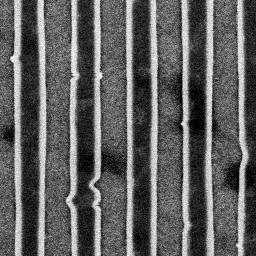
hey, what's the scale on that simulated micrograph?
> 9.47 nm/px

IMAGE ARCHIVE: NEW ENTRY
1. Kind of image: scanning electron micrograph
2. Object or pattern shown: parallel lines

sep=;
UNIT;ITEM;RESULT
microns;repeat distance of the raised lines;0.529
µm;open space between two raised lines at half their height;0.294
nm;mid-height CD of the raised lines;236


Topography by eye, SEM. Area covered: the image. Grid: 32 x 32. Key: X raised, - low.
--XXX----XXX----XXX----XXX----XX
--XXX----XXX----XXX----XXX----XX
--XXX----XXX----XXX----XXX----XX
--XXX----XXX----XXX----XXX----XX
--XXX----XXX----XXX----XXX----XX
--XXX----XXX----XXX----XXX----XX
--XXX----XXX----XXX----XXX----XX
--XXX----XXX----XXX----XXX----XX
--XXX----XXX----XXX----XXX----XX
--XXX----XXX----XXX----XXX----XX
--XXX----XXX----XXX----XXX----XX
--XXX----XXX----XXX----XXX----XX
--XXX----XXX----XXX----XXX----XX
--XXX----XXX----XXX----XXX----XX
--XXX----XXX----XXX----XXX----XX
--XXX----XXX----XXX----XXX----XX
--XXX----XXX----XXX----XXX----XX
--XXX----XXX----XXX----XXX----XX
--XXX----XXX----XXX----XXX----XX
--XXX----XXX----XXX----XXX-----X
--XXX----XXX----XXX----XXX----XX
--XXX----XXX----XXX----XXX----XX
--XXX----XXX----XXX----XXX----XX
--XXX----XXX----XXX----XXX----XX
--XXX----XXX----XXX----XXX----XX
--XXX----XXX----XXX----XXX----XX
--XXX----XXX----XXX----XXX----XX
--XXX----XXX----XXX----XXX----XX
--XXX----XXX----XXX----XXX----XX
--XXX----XXX----XXX----XXX----XX
--XXX----XXX----XXX----XXX----XX
--XXX----XXX----XXX----XXX----XX